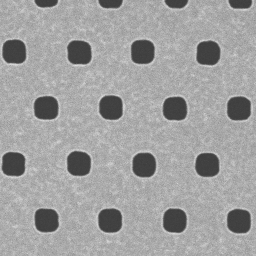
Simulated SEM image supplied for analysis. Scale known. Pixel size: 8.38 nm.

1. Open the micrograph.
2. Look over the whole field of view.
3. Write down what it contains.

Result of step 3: a regular array of holes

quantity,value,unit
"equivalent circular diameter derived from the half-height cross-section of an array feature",212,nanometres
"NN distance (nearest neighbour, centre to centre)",534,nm